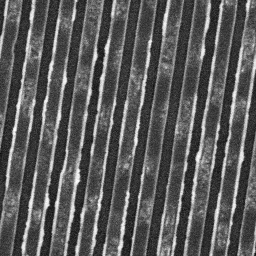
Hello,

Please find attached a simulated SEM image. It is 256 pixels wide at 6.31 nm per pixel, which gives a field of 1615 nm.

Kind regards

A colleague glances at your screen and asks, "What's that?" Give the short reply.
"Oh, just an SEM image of parallel lines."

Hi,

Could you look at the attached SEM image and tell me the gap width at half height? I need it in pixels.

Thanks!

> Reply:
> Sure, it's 10.3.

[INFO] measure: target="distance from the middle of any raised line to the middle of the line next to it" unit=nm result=168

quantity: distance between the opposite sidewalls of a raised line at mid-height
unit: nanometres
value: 104